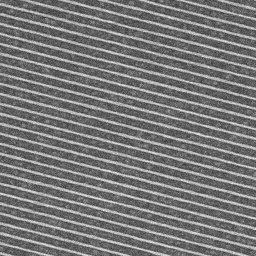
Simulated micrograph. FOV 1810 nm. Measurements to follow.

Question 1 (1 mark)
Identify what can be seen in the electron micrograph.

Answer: parallel lines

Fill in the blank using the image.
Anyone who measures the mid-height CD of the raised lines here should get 11.1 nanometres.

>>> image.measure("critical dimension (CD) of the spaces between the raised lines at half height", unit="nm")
56.6